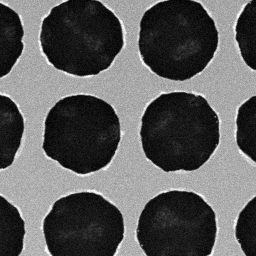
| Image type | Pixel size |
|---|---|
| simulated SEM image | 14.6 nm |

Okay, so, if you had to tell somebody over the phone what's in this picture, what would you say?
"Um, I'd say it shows holes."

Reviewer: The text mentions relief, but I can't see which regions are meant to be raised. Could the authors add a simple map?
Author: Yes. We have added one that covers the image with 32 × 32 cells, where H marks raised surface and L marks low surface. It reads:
HHHHHHHLLLLLLHHHHHHLLLLLLHHHHHHL
LLHHHHLLLLLLLLHHHHLLLLLLLLHHHHLL
LLLHHLLLLLLLLLLHHHLLLLLLLLLHHHLL
LLLHHLLLLLLLLLLHHLLLLLLLLLLHHLLL
LLLHHLLLLLLLLLLHHLLLLLLLLLLHHLLL
LLLHHLLLLLLLLLLHHLLLLLLLLLLHHHLL
LLLHHLLLLLLLLLLHHLLLLLLLLLLHHHLL
LLHHHHLLLLLLLLHHHHLLLLLLLLHHHHLL
LLHHHHHLLLLLLHHHHHHLLLLLLLHHHHHL
LHHHHHHHHHLHHHHHHHHHLLLLHHHHHHHH
HHHHHHHHHHHHHHHHHHHHHHHHHHHHHHHH
HHHHHHHHHHHHHHHHHHHHHHLHHHHHHHHH
LHHHHHHHLLLLLHHHHHHLLLLLLLHHHHHL
LLHHHHLLLLLLLLHHHHLLLLLLLLHHHHLL
LLLHHHLLLLLLLLLHHHLLLLLLLLLHHHLL
LLLHHHLLLLLLLLLHHHLLLLLLLLLHHHLL
LLLHHLLLLLLLLLLHHHLLLLLLLLLHHHLL
LLLHHLLLLLLLLLLHHHLLLLLLLLLHHHLL
LLHHHLLLLLLLLLLHHHLLLLLLLLLHHHLL
LLHHHHLLLLLLLLHHHHLLLLLLLLHHHHHL
LHHHHHHLLLLLLHHHHHHLLLLLLHHHHHHH
HHHHHHHHHLLLHHHHHHHHHHHHHHHHHHHH
HHHHHHHHHHHHHHHHHHHHHHHHHHHHHHHH
HHHHHHHHHHHHHHHHHHHHHHHHHHHHHHHH
HHHHHHHHLLLLLHHHHHHHLLLLLHHHHHHH
LHHHHHHLLLLLLLHHHHLLLLLLLLHHHHHL
LLHHHHLLLLLLLLLHHHLLLLLLLLLHHHLL
LLLHHLLLLLLLLLLHHLLLLLLLLLLHHHLL
LLLHHLLLLLLLLLLLHLLLLLLLLLLHHLLL
LLLHHHLLLLLLLLLHHLLLLLLLLLLHHLLL
LLLHHHLLLLLLLLLHHLLLLLLLLLLHHHLL
LLLHHHLLLLLLLLHHHHLLLLLLLLHHHHLL